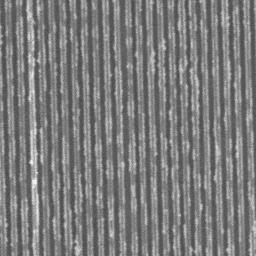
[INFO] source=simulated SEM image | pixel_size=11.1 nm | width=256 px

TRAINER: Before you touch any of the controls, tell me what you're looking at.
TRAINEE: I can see parallel lines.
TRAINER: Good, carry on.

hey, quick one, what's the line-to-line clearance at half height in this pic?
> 65.3 nanometres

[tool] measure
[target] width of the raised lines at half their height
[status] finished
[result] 55.6 nm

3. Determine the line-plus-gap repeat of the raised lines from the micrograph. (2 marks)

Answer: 121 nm